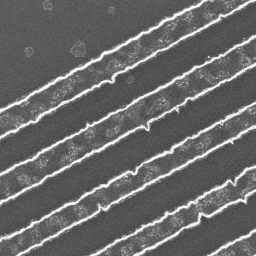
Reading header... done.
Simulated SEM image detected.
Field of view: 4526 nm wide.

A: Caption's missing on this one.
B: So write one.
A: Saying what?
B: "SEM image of parallel lines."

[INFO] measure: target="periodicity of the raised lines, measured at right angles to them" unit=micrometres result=0.998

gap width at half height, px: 33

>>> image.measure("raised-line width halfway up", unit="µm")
0.402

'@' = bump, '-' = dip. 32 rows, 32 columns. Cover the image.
-------------------------@@@@@@-
-----------------------@@@@@@---
---------------------@@@@@@-----
-------------------@@@@@@-------
-----------------@@@@@@---------
----------------@@@@@@--------@@
--------------@@@@@@--------@@@@
------------@@@@@@---------@@@@@
----------@@@@@@--------@@@@@@@-
--------@@@@@@---------@@@@@@---
------@@@@@@@--------@@@@@@-----
----@@@@@@@--------@@@@@@@------
---@@@@@@--------@@@@@@---------
-@@@@@@---------@@@@@@---------@
@@@@@--------@@@@@@@---------@@@
@@@---------@@@@@@@--------@@@@@
@---------@@@@@@---------@@@@@@-
--------@@@@@@@--------@@@@@@---
------@@@@@@@---------@@@@@-----
-----@@@@@@---------@@@@@-------
--@@@@@@@---------@@@@@---------
-@@@@@@----------@@@@----------@
@@@@@---------@@@@@-----------@@
@@@@--------@@@@@@---------@@@@@
@@--------@@@@@@---------@@@@@@-
---------@@@@@----------@@@@@---
-------@@@@@----------@@@@@-----
-----@@@@@----------@@@@@-------
---@@@@@@---------@@@@@---------
-@@@@@@---------@@@@@@---------@
@@@@@---------@@@@@@---------@@@
@@@---------@@@@@@---------@@@@@